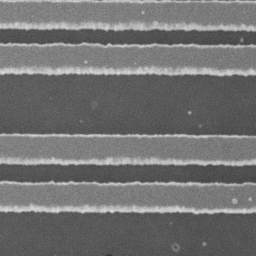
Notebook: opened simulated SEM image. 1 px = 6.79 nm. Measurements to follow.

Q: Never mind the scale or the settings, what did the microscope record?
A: lines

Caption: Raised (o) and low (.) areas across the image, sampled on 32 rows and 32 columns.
oooooooooooooooooooooooooooooooo
oooooooooooooooooooooooooooooooo
oooooooooooooooooooooooooooooooo
.............o.......o.ooooooooo
................................
.o.....o..o.....................
oooooooooooooooooooooooooooooooo
oooooooooooooooooooooooooooooooo
oooooooooooooooooooooooooooooooo
................................
................................
................................
................................
................................
................................
................................
................................
oooooooooooooooooooooooooooooooo
oooooooooooooooooooooooooooooooo
oooooooooooooooooooooooooooooooo
.............................oo.
................................
................................
oooooooooooooooooooooooooooooooo
oooooooooooooooooooooooooooooooo
oooooooooooooooooooooooooooooooo
................................
................................
................................
................................
................................
................................